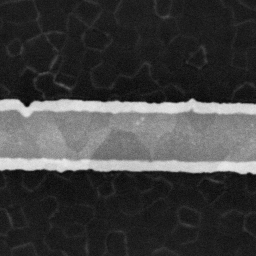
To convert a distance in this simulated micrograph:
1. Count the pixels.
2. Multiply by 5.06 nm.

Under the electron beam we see one or a few lines or trenches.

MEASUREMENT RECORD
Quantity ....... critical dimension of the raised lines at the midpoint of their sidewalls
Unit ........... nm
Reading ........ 292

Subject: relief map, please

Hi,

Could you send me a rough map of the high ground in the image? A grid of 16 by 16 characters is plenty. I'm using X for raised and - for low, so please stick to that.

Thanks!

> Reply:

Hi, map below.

----------------
----------------
----------------
----------------
----------------
----------------
----------------
XXXXXXXXXXXXXXXX
XXXXXXXXXXXXXXXX
XXXXXXXXXXXXXXXX
----------------
----------------
----------------
----------------
----------------
----------------